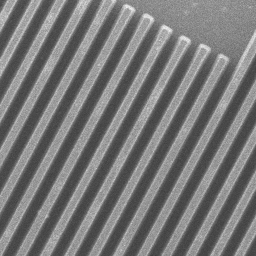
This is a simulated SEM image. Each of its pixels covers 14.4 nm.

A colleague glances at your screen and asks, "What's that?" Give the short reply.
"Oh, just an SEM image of parallel lines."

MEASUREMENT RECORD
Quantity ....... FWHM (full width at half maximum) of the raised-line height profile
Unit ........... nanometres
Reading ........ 147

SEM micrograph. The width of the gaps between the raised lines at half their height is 158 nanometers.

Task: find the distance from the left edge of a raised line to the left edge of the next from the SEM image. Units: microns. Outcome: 0.307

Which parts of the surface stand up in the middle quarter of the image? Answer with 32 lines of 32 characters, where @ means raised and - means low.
-@@@---@@@---@@@---@@@----@@----
-@@----@@----@@----@@----@@@---@
@@@---@@@---@@@---@@@---@@@---@@
@@----@@----@@----@@----@@----@@
@@---@@@---@@@---@@@---@@@---@@@
@---@@@----@@----@@----@@----@@@
@---@@@---@@@---@@@---@@@---@@@-
---@@@---@@@----@@----@@----@@@-
---@@@---@@@---@@@---@@@---@@@--
--@@@---@@@---@@@----@@----@@---
--@@@---@@@---@@@---@@@---@@@---
-@@@---@@@---@@@----@@----@@----
-@@@---@@@---@@@---@@@---@@@---@
@@@---@@@---@@@----@@----@@----@
@@----@@----@@@---@@@---@@@---@@
@@---@@@---@@@---@@@---@@@----@@
@----@@----@@----@@----@@@---@@@
@---@@@---@@@---@@@---@@@---@@@-
----@@----@@----@@@---@@@---@@@-
---@@@---@@@---@@@---@@@---@@@--
--@@@----@@----@@----@@@---@@@--
--@@@---@@@---@@@---@@@---@@@---
-@@@---@@@----@@----@@@---@@@---
-@@@---@@@---@@@---@@@---@@@---@
@@@---@@@----@@----@@----@@----@
@@@---@@@---@@@---@@@---@@@---@@
@@---@@@----@@----@@----@@----@@
@@---@@@---@@@---@@@---@@@---@@@
@---@@@---@@@----@@----@@----@@-
----@@----@@@---@@@---@@@---@@@-
---@@@---@@@---@@@---@@@----@@--
---@@----@@@---@@@---@@@---@@@--